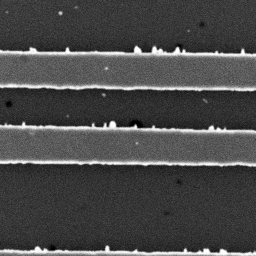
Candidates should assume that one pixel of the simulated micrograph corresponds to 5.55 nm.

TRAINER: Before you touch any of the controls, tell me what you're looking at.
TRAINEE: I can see lines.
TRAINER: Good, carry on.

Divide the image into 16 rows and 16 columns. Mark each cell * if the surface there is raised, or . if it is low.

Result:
................
................
................
****************
****************
...*************
................
................
****************
****************
................
................
................
................
................
................